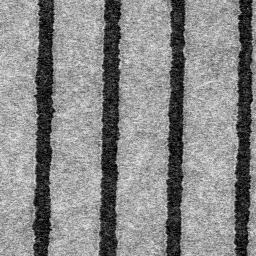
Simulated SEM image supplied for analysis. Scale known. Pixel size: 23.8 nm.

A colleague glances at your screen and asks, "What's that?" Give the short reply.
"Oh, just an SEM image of one or a few lines or trenches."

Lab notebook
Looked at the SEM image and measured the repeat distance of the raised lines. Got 1590 nm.